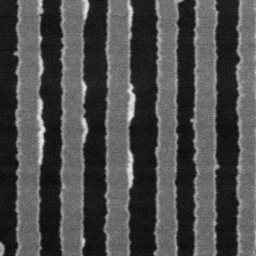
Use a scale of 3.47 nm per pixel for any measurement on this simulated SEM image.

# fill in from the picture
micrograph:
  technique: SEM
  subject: lines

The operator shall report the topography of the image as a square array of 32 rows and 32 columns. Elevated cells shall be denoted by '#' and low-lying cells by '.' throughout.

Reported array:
..###...###...##....##...##...##
..###...###...###...##..###...##
..###...###..###....##...##...##
..###...##...###....##..###...##
..###...##...###....##..###...##
..###...##...###....##..###...##
..###...##...###....##..###...##
..###...##...###....##..###...##
..###...##....##....##..###...##
..###...##...###....##..###...##
..###...##...###....##..###...##
..###...###...###...##..###...##
..###...##...####...##..###...##
..###...##...####...##..###...##
..###...##...####...##..###...##
..###...###..###....##..###...##
..###...###..###....##..###...##
..###...##...###....##..###...##
..###...##...###....##..###...##
..###...##...###....##..###...##
..###...##...####...##..###...##
..###...##...###....##...##...##
..###...##...####...##..###...##
..###...##...###....##..###...##
..###...##...###....##..###...##
..###...##...###....##..###...##
..###...##...###....##..###...##
..###...##...###....##..###...##
..###...##...###...###..###...##
..###...##...###...###..###...##
..###...##...###....##..###...##
..###...##...###...###..###...##